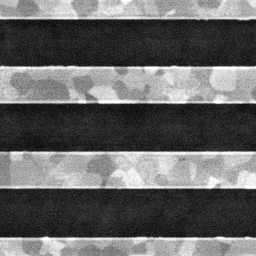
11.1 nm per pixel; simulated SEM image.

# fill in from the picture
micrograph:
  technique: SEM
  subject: lines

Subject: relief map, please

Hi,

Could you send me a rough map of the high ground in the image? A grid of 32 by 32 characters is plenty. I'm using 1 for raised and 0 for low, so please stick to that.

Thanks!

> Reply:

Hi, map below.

11111111111111111111111111111111
11111111111111111111111111111111
00000000000000000000000000000000
00000000000000000000000000000000
00000000000000000000000000000000
00000000000000000000000000000000
00000000000000000000000000000000
00000000000000000000000000000000
11111111111111111111111111111111
11111111111111111111111111111111
11111111111111111111111111111111
11111111111111111111111111111111
11111111111111111111111111111111
00000000000000000000000000000000
00000000000000000000000000000000
00000000000000000000000000000000
00000000000000000000000000000000
00000000000000000000000000000000
00000000000000000000000000000000
11111111111111111111111111111111
11111111111111111111111111111111
11111111111111111111111111111111
11111111111111111111111111111111
00000000000000000000000000000000
00000000000000000000000000000000
00000000000000000000000000000000
00000000000000000000000000000000
00000000000000000000000000000000
00000000000000000000000000000000
00000000000000000000000000000000
11111111111111111111111111111111
11111111111111111111111111111111